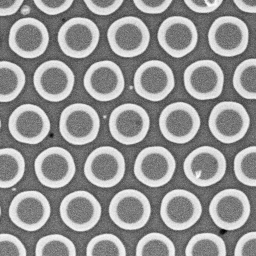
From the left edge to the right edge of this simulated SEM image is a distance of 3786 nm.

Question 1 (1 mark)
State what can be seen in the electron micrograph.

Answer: an array of small figures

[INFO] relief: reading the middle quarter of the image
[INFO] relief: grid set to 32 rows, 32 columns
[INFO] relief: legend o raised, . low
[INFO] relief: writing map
o......oooooo......ooooooo.....o
oo....oooooooo....ooooooooo...oo
oo...ooooooooo....ooooooooo...oo
oo...oooooooooo...ooooooooo...oo
oo...oooooooooo...ooooooooo...oo
oo...oooooooooo...ooooooooo...oo
oo....ooooooooo...ooooooooo....o
o.....oooooooo.....ooooooo......
........oooo........ooooo.......
................................
..oooo........ooooo.......oooooo
ooooooo......ooooooo.....ooooooo
oooooooo....ooooooooo...oooooooo
ooooooooo...ooooooooo...oooooooo
ooooooooo..oooooooooo...oooooooo
ooooooooo..oooooooooo...oooooooo
ooooooooo...ooooooooo...oooooooo
oooooooo....oooooooo.....ooooooo
oooooooo.....ooooooo......oooooo
.ooooo........ooooo........oooo.
................................
........ooooo.......oooooo......
o......ooooooo.....oooooooo.....
oo....ooooooooo...ooooooooo....o
oo....ooooooooo...oooooooooo..oo
ooo..oooooooooo...oooooooooo..oo
ooo..oooooooooo...oooooooooo..oo
oo...oooooooooo...ooooooooo...oo
oo....oooooooo....ooooooooo....o
o......ooooooo......oooooo......
.........ooo.........ooo........
................................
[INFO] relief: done